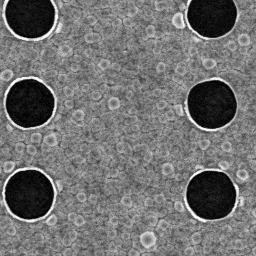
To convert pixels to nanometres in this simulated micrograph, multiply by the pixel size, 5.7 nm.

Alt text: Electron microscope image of holes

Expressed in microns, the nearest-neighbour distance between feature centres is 0.519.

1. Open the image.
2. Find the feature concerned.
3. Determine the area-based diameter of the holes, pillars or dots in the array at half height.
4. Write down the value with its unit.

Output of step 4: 285 nm